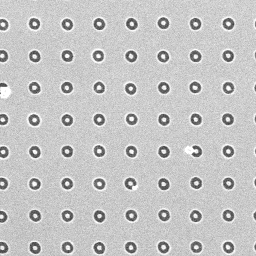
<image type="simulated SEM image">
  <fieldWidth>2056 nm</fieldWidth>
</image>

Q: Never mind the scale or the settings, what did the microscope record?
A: a regular array of ring-shaped grooves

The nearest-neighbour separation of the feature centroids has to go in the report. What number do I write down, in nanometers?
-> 252